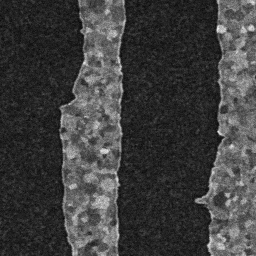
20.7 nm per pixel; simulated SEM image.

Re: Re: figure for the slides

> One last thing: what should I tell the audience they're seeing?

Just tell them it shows one or a few lines or trenches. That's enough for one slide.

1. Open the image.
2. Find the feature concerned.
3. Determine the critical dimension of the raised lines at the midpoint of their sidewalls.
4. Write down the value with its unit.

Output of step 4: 1040 nanometers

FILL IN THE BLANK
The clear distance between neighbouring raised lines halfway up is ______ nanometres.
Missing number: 2000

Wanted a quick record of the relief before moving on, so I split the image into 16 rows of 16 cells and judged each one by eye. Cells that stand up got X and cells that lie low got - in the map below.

-----XXX------XX
-----XXX------XX
-----XXX------XX
-----XX-------XX
-----XXX------XX
-----XXX------XX
----XXXX------XX
----XXX-------XX
----XXXX------XX
----XXXX------XX
----XXX------XXX
----XXX------XXX
----XXX------XXX
----XXX------XXX
----XXX------XXX
----XXX------XXX